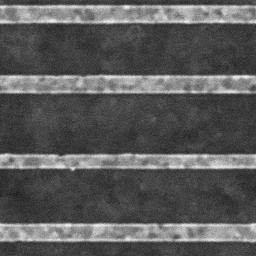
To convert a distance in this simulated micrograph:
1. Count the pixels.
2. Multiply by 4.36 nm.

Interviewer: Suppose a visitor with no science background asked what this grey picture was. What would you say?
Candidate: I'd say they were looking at one or a few lines or trenches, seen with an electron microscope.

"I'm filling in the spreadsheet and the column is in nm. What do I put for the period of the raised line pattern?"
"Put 317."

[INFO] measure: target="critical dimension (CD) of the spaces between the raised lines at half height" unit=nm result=250